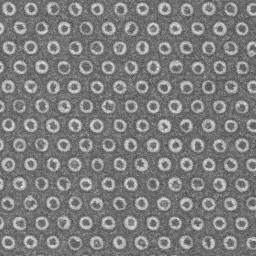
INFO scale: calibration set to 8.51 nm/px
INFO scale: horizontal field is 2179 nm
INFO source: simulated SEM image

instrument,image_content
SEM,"a regular array of raised bodies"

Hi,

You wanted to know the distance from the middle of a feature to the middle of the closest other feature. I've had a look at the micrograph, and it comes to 184 nm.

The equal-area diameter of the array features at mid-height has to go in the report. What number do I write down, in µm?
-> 0.104